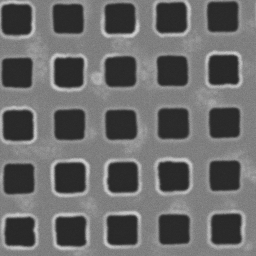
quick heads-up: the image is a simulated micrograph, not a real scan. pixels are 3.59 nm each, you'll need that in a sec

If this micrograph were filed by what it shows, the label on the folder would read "a regular array of holes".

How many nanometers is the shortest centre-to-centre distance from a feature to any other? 184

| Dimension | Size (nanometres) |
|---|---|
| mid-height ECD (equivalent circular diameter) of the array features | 121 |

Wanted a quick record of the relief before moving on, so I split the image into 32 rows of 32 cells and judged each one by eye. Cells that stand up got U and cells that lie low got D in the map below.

UDDUUUUUUDUUUUDDUUUUDDDUUUDDDDUU
DDDDUUDDDDUUUDDDDUUDDDDUUUDDDDUU
DDDDUUUDDDUUUDDDDUUDDDDUUUDDDDUU
DDDDUUUDDDUUUDDDDUUUDDDUUUDDDDUU
UUUUUUUUUUUUUUUUUUUUUUUUUUUUUUUU
UUUUUUUUUUUUUUUUUUUUUUUUUUUUUUUU
UUUUUUUUUUUUUUUUUUUUUUUUUUUUUUUU
UDDDUUUDDDUUUDDDDUUUDDDUUUDDDDUU
DDDDUUUDDDUUUDDDDUUUDDDDUUDDDDUU
DDDDUUUDDDUUUDDDDUUUDDDDUUDDDDUU
DDDDUUUDDDUUUDDDDUUUDDDUUUUDDDUU
UUUUUUUUUUUUUUUUUUUUUUUUUUUUUUUU
UUUUUUUUUUUUUUUUUUUUUUUUUUUUUUUU
UUUUUUUUUUUUUUUUUUUUUUUUUUUUDUUU
DDDDUUUDDDDUUDDDDUUUDDDDUUDDDDUU
DDDDUUUDDDDUUDDDDUUUDDDDUUDDDDUU
DDDDUUUDDDDUUDDDDUUUDDDDUUDDDDUU
UDDDUUUUDDUUUUDDUUUUUUUUUUUUUUUU
UUUUUUUUUUUUUUUUUUUUUUUUUUUUUUUU
UUUUUUUUUUUUUUUUUUUUUUUUUUUUUUUU
UDDDUUUDDDUUUUDDDUUUDDDUUUDDDDUU
DDDDUUUDDDDUUDDDDUUUDDDDUUDDDDUU
DDDDUUUDDDDUUDDDDUUUDDDDUUDDDDUU
DDDDUUUDDDDUUUDDDUUUDDDUUUDDDDUU
UUUUUUUUUUUUUUUUUUUUUUUUUUUUUUUU
UUUUUUUUUUUUUUUUUUUUUUUUUUUUUUUU
UUUUUUUUUUUUUUUUUUUUUUUUUUUUUUUU
UDDDUUUDDDDUUDDDDUUUDDDDUUDDDDUU
UDDDUUUDDDDUUDDDDUUUDDDDUUDDDDUU
UDDDUUUDDDDUUDDDDUUUDDDDUUDDDDUU
UDDDUUUDDDDUUUDDDUUUDDDUUUUDDDUU
UUUUUUUUUUUUUUUUUUUUUUUUUUUUUUUU